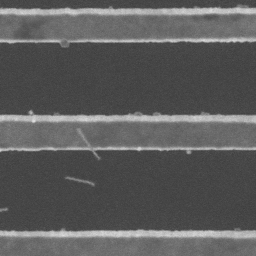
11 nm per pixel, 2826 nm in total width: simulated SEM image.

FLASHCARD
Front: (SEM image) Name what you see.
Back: lines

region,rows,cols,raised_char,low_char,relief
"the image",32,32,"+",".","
................................
++++++++++++++++++++++++++++++++
++++++++++++++++++++++++++++++++
++++++++++++++++++++++++++++++++
++++++++++++++++++++++++++++++++
.......++.......................
................................
................................
................................
................................
................................
................................
................................
................................
................................
++++++++++++++++++++++++++++++++
++++++++++++++++++++++++++++++++
++++++++++++++++++++++++++++++++
++++++++++++++++++++++++++++++++
................................
................................
................................
................................
................................
................................
................................
................................
................................
................................
++++++++++++++++++++++++++++++++
++++++++++++++++++++++++++++++++
++++++++++++++++++++++++++++++++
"